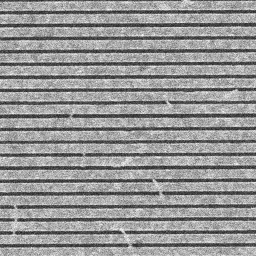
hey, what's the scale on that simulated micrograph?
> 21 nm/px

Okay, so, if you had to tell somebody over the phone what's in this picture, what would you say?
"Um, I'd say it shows parallel lines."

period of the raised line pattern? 271 nm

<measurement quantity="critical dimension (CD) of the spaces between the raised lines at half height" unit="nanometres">83.9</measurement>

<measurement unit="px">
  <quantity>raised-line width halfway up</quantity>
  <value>8.75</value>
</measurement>